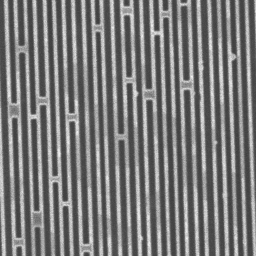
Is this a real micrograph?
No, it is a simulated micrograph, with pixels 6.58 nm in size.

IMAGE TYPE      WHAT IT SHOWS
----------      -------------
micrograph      parallel lines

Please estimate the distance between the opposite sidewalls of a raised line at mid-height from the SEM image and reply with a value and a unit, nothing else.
24.7 nanometres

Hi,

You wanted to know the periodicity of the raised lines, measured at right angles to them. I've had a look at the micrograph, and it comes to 9.6 px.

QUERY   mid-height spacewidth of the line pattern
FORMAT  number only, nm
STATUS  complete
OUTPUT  37